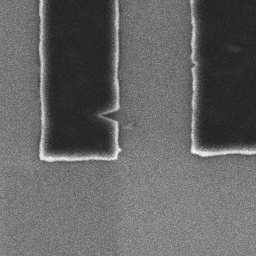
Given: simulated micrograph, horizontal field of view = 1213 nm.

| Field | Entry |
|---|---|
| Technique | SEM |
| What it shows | one or a few lines or trenches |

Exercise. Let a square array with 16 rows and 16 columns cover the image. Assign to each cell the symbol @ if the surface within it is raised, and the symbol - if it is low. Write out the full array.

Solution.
---@@@@-----@@@@
---@@@@-----@@@@
---@@@@-----@@@@
---@@@@-----@@@@
---@@@@-----@@@@
---@@@@-----@@@@
---@@@@-----@@@@
---@@@@-----@@@@
---@@@@-----@@@@
---@@@@-----@@@@
----------------
----------------
----------------
----------------
----------------
----------------